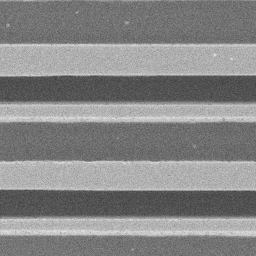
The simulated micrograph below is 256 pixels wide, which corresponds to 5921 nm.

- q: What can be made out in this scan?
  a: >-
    lines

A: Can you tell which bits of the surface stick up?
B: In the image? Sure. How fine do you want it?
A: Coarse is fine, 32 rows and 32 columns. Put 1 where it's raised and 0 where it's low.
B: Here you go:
00000000000000000000000000000000
00000000000000000000000000000000
00000000000000000000000000000000
00000000000000000000000000000000
00000000000000000000000000000000
00000000000000000000000000000000
11111111111111111111111111111111
11111111111111111111111111111111
11111111111111111111111111111111
00000000000000000000000000000000
00000000000000000000000000000000
00000000000000000000000000000000
00000000000000000000000000000000
11111111111111111111111111111111
11111111111111111111111111111111
00000000000000000000000000000000
00000000000000000000000000000000
00000000000000000000000000000000
00000000000000000000000000000000
00000000000000000000000000000000
11111111111111111111111111111111
11111111111111111111111111111111
11111111111111111111111111111111
11111111111111111111111111111111
00000000000000000000000000000000
00000000000000000000000000000000
00000000000000000000000000000000
11111111111111111111111111111111
11111111111111111111111111111111
00000000000000000000000000000000
00000000000000000000000000000000
00000000000000000000000000000000